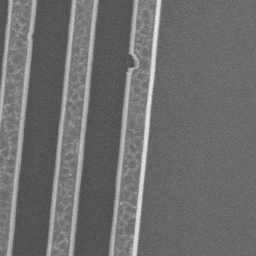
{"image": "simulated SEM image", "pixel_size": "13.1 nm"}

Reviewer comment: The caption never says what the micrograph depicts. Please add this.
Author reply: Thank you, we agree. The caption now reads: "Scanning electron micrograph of parallel lines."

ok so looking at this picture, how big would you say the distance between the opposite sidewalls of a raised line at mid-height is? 23.1 pixels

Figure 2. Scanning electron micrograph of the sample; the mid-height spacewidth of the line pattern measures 517 nm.